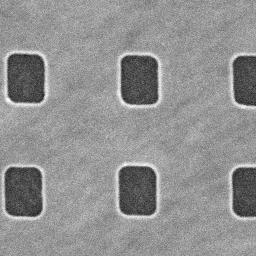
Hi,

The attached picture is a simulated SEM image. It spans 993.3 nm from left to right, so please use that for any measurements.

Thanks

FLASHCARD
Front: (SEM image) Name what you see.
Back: holes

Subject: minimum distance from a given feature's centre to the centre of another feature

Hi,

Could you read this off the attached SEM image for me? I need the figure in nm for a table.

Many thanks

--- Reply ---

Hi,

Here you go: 435